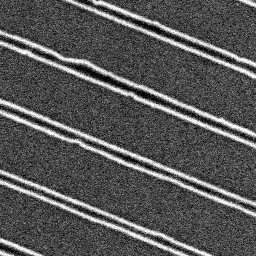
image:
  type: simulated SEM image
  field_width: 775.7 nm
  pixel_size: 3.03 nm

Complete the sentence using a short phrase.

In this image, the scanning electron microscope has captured one or a few lines or trenches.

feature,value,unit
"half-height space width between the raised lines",161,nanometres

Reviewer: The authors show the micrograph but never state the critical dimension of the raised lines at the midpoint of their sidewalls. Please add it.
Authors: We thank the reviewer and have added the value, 34.4 nanometers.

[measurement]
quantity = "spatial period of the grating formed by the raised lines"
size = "64.6 px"